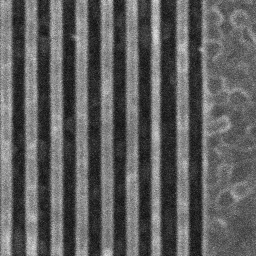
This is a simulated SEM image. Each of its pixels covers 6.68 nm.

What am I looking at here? parallel lines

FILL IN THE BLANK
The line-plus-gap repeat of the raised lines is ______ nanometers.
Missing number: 168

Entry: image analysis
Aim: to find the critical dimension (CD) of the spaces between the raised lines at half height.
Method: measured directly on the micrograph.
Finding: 0.0968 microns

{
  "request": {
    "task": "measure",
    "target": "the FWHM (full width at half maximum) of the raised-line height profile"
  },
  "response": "73.4 nm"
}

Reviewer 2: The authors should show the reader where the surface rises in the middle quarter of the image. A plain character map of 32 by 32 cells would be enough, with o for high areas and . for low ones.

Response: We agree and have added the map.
...ooo....oo....oo....oo....ooo.
...ooo....oo....oo....oo....ooo.
...ooo....oo....oo....oo....ooo.
...ooo....oo....oo....oo....ooo.
...ooo....oo....oo....oo....ooo.
...ooo....oo....oo....oo....ooo.
...ooo....oo....oo....oo....ooo.
...ooo....oo....oo....oo....ooo.
...ooo....oo....oo....oo....ooo.
...ooo....oo....oo....oo....ooo.
...ooo....oo....oo....oo....ooo.
...ooo....oo....oo....oo....ooo.
...ooo....oo....oo....oo....ooo.
...ooo....oo....oo....oo....ooo.
...ooo....oo....oo....oo....ooo.
...ooo....oo....oo....oo....ooo.
...ooo....oo....oo....oo....ooo.
...ooo....oo....oo....oo....ooo.
...ooo....oo....oo....oo....ooo.
...ooo....oo....oo....oo....ooo.
...ooo....oo....oo....oo....ooo.
...ooo....oo....oo....oo....ooo.
...ooo....oo....oo....oo....ooo.
...ooo....oo....oo....oo....ooo.
...ooo....oo....oo....oo....ooo.
...ooo....oo....oo....oo....ooo.
...ooo....oo....oo....oo....ooo.
...ooo....oo....oo....oo....ooo.
...ooo....oo....oo....oo....ooo.
...ooo....oo....oo....oo....ooo.
...ooo....oo....oo....oo....ooo.
...ooo....oo....oo....oo....ooo.